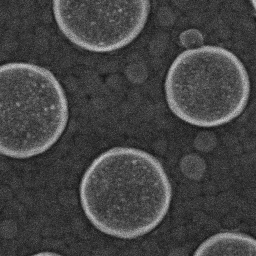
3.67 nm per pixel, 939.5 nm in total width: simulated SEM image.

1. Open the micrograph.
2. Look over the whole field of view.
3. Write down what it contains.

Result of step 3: raised bodies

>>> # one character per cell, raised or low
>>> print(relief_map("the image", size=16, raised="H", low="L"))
LLLHHHHHHLLLLLLL
LLLLHHHHHLLLLLLL
LLLLLHHHLLLLLLLL
LLLLLLLLLLLHHHLL
HHHLLLLLLLLHHHHL
HHHHLLLLLLHHHHHL
HHHHLLLLLLLHHHHL
HHHHLLLLLLLLHHLL
HHHHLLLLLLLLLLLL
HHLLLLLHHLLLLLLL
LLLLLLHHHHLLLLLL
LLLLLHHHHHLLLLLL
LLLLLHHHHHLLLLLL
LLLLLLHHHHLLLLLL
LLLLLLLHHLLLLLLL
LLLLLLLLLLLLLHHH